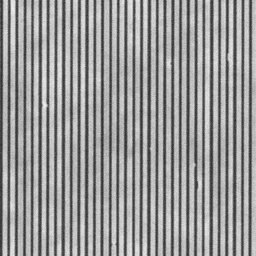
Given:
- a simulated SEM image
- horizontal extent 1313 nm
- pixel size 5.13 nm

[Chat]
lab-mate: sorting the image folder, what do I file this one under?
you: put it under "parallel lines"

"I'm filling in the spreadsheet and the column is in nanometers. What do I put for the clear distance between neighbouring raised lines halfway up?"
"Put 14.8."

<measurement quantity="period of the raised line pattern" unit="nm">39.9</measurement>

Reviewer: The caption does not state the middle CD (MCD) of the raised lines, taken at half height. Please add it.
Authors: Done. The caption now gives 23.7 nanometers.